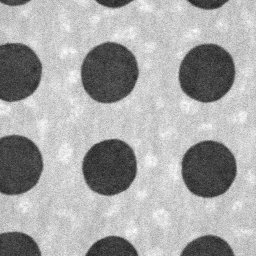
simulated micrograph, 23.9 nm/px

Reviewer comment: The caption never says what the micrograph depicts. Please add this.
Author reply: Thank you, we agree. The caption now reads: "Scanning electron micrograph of holes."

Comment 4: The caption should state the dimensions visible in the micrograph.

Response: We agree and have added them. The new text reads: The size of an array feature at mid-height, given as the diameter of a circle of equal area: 57.9 pixels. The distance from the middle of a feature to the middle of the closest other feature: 2280 nanometres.